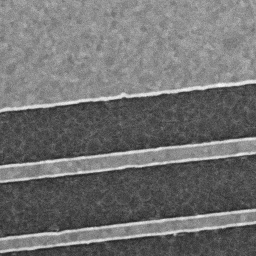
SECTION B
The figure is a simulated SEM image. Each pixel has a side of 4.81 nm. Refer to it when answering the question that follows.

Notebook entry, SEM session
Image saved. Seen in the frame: one or a few lines or trenches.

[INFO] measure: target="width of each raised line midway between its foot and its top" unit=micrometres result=0.0657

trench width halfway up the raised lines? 273 nm